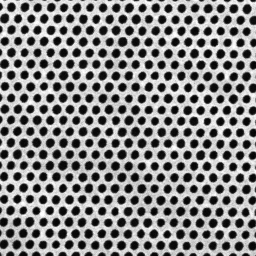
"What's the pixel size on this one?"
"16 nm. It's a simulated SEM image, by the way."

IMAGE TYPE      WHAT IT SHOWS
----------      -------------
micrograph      a regular array of holes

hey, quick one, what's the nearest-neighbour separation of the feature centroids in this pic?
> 203 nm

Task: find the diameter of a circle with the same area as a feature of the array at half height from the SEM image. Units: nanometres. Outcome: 149